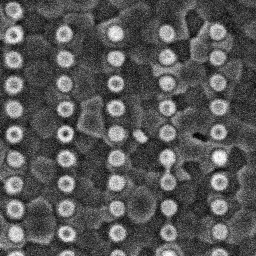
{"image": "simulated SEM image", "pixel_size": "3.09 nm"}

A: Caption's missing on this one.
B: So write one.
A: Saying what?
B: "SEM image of a regular array of raised bodies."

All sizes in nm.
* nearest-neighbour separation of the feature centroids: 63.3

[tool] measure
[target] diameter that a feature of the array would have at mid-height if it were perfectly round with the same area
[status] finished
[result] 46.3 nm